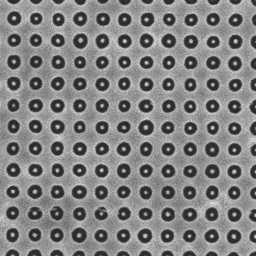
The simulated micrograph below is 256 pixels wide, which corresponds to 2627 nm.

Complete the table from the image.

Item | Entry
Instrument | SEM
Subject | a regular array of ring-shaped grooves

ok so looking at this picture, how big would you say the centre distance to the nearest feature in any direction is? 219 nm